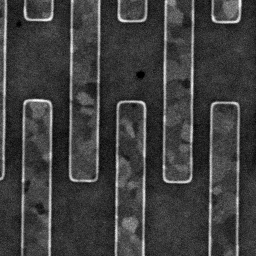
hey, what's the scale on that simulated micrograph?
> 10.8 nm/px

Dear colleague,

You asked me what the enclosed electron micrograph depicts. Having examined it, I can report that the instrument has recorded groups of lines, slits or small figures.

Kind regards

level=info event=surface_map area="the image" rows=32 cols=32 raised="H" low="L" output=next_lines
HLLHHHLLLHHHLLLHHHLLLHHHLLLHHHLL
HLLHHHLLLHHHLLLHHHLLLHHHLLLHHHLL
HLLLLLLLLHHHLLLHHHLLLHHHLLLHHHLL
HLLLLLLLLHHHLLLLLLLLLHHHLLLLLLLL
HLLLLLLLLHHHLLLLLLLLLHHHLLLLLLLL
HLLLLLLLLHHHLLLLLLLLLHHHLLLLLLLL
HLLLLLLLLHHHLLLLLLLLLHHHLLLLLLLL
HLLLLLLLLHHHLLLLLLLLLHHHLLLLLLLL
HLLLLLLLLHHHLLLLLLLLLHHHLLLLLLLL
HLLLLLLLLHHHLLLLLLLLLHHHLLLLLLLL
HLLLLLLLLHHHLLLLLLLLLHHHLLLLLLLL
HLLLLLLLLHHHLLLLLLLLLHHHLLLLLLLL
HLLLLLLLLHHHLLLLLLLLLHHHLLLLLLLL
HLLHHHLLLHHHLLLHHHLLLHHHLLHHHHLL
HLLHHHLLLHHHLLLHHHLLLHHHLLHHHHLL
HLLHHHLLLHHHLLLHHHLLLHHHLLHHHHLL
LLLHHHLLLHHHLLLHHHLLLHHHLLHHHHLL
LLLHHHLLLHHHLLLHHHLLLHHHLLHHHHLL
LLLHHHLLLHHHLLLHHHLLLHHHLLHHHHLL
LLLHHHLLLHHHLLLHHHLLLHHHLLHHHHLL
LLLHHHLLLHHHLLLHHHLLLHHHLLHHHHLL
LLLHHHLLLHHHLLLHHHLLLHHHLLHHHHLL
LLLHHHLLLHHHLLLHHHLLLHHHLLHHHHLL
LLLHHHLLLLLLLLLHHHLLLLLLLLHHHHLL
LLLHHHLLLLLLLLLHHHLLLLLLLLHHHHLL
LLLHHHLLLLLLLLLHHHLLLLLLLLHHHHLL
LLLHHHLLLLLLLLLHHHLLLLLLLLHHHHLL
LLLHHHLLLLLLLLLHHHLLLLLLLLHHHHLL
LLLHHHLLLLLLLLLHHHLLLLLLLLHHHHLL
LLLHHHLLLLLLLLLHHHLLLLLLLLHHHHLL
LLLHHHLLLLLLLLHHHHLLLLLLLLHHHHLL
LLLHHHLLLLLLLLHHHHLLLLLLLLHHHHLL